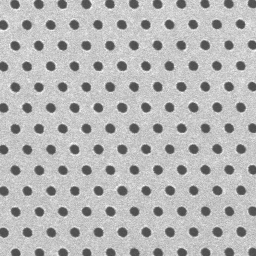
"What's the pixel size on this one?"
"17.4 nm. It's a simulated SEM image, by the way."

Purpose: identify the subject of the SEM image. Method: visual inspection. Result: a regular array of holes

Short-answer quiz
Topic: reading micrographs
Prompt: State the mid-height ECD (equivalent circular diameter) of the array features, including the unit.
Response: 177 nm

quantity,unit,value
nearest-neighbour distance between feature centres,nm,411